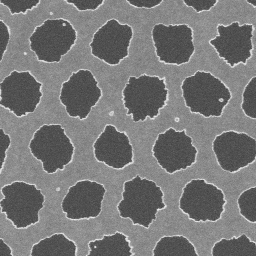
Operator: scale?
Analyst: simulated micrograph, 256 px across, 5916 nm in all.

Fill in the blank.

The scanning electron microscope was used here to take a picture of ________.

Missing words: a regular array of holes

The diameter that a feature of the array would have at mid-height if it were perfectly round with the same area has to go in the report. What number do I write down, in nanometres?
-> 968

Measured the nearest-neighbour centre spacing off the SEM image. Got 1370 nanometres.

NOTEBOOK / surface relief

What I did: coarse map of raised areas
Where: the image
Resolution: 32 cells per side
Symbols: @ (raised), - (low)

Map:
-----@@@@----@@@----@@@----@@@@-
@@-@@@@@@@@@@@@@@@@@@@@@@@@@@@@@
@@@@@@--@@@@@@@@@@@@@@@@@@@@@@@@
-@@@@----@@@@---@@@-----@@@----@
-@@@-----@@@----@@@-----@@@----@
-@@@-----@@-----@@@-----@@@-----
-@@@----@@@@----@@@@----@@@----@
@@@@@--@@@@@@--@@@@@----@@@@---@
@@@@@@@@@@@@@@@@@@@@@@@@@@@@@@@@
@---@@@@@---@@@@@@-@@@@@---@@@@@
-----@@@----@@@@-----@@-----@@@-
-----@@@-----@@------@@------@--
-----@@@----@@@@-----@@------@--
@---@@@@---@@@@@----@@@@----@@--
@@@@@@@@@--@@@@@---@@@@@@@-@@@@-
@@@@@@@@@@@@@@@@@@@@@@@@@@@@@@@@
-@@@@---@@@@@--@@@@@@--@@@@@-@@@
-@@@-----@@@----@@@@----@@@-----
-@@@-----@@@----@@@-----@@@-----
-@@@-----@@@-----@@-----@@@-----
@@@@@---@@@@@---@@@@----@@@----@
@@@@@@-@@@@@@@@@@@@@@-@@@@@@@@@@
@@@@@@@@@@@@@@@@---@@@@@-@@@@@@@
-----@@@@----@@@----@@@----@@@@-
-----@@@-----@@-----@@@-----@@--
-----@@@-----@@-----@@------@@--
-----@@@-----@@-----@@@-----@@--
@----@@@@@@@@@@@---@@@@@---@@@@-
@@@@@@@@@@@@@@@@@@@@@@@@@@@@@@@@
@@@@@@--@@@@@--@@@@@@@@@@@@@@@-@
-@@@@----@@-----@@@@----@@@-----
-@@@-----@@-----@@@-----@@@-----